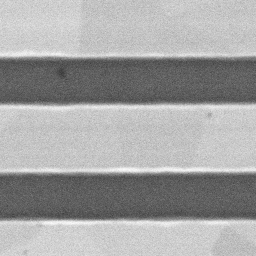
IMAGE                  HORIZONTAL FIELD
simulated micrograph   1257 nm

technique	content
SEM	wiring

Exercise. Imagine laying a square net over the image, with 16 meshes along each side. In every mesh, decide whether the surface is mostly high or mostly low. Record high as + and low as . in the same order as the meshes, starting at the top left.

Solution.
++++++++++++++++
++++++++++++++++
++++++++++++++++
++++++++++++++++
................
................
................
++++++++++++++++
++++++++++++++++
++++++++++++++++
++++++++++++++++
................
................
................
++++++++++++++++
++++++++++++++++